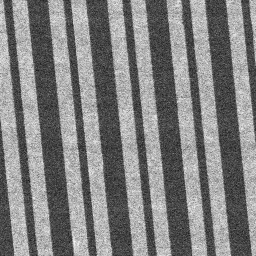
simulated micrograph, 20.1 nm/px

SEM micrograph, parallel lines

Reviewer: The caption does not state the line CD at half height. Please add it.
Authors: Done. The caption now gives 14.4 pixels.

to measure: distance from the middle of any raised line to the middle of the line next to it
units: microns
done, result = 0.593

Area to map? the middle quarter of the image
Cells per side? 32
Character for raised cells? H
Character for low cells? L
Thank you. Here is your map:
HLLLHHHLLLLLLHHHLLHHHHLLLLLHHHHL
HLLLHHHLLLLLLHHHLLLHHHLLLLLHHHHL
HLLLHHHLLLLLLHHHLLLHHHLLLLLLHHHL
HHLLHHHLLLLLLHHHLLLHHHLLLLLLHHHL
HHLLHHHLLLLLLHHHLLLHHHLLLLLLHHHL
HHLLHHHHLLLLLHHHHLLHHHLLLLLLHHHL
HHLLHHHHLLLLLHHHHLLHHHLLLLLLHHHL
HHLLHHHHLLLLLHHHHLLHHHHLLLLLHHHH
HHLLHHHHLLLLLHHHHLLHHHHLLLLLHHHH
HHLLHHHHLLLLLLHHHLLHHHHLLLLLHHHH
HHLLLHHHLLLLLLHHHLLHHHHLLLLLLHHH
HHLLLHHHLLLLLLHHHLLLHHHLLLLLLHHH
HHLLLHHHLLLLLLHHHLLLHHHLLLLLLHHH
HHHLLHHHLLLLLLHHHLLLHHHLLLLLLHHH
HHHLLHHHLLLLLLHHHLLLHHHLLLLLLHHH
HHHLLHHHHLLLLLHHHHLLHHHLLLLLLHHH
HHHLLHHHHLLLLLHHHHLLHHHLLLLLLHHH
HHHLLHHHHLLLLLHHHHLLHHHHLLLLLHHH
HHHLLLHHHLLLLLHHHHLLHHHHLLLLLHHH
HHHLLLHHHLLLLLLHHHLLHHHHLLLLLHHH
HHHLLLHHHLLLLLLHHHLLLHHHLLLLLHHH
HHHLLLHHHLLLLLLHHHLLLHHHLLLLLLHH
HHHHLLHHHLLLLLLHHHLLLHHHLLLLLLHH
HHHHLLHHHLLLLLLHHHLLLHHHLLLLLLHH
HHHHLLHHHHLLLLLHHHHLLHHHLLLLLLHH
HHHHLLHHHHLLLLLHHHHLLHHHLLLLLLHH
HHHHLLHHHHLLLLLHHHHLLHHHLLLLLLHH
LHHHLLHHHHLLLLLHHHHLLHHHHLLLLLHH
LHHHLLHHHHLLLLLHHHHLLHHHHLLLLLHH
LHHHLLLHHHLLLLLLHHHLLHHHHLLLLLHH
LHHHLLLHHHLLLLLLHHHLLLHHHLLLLLLH
LHHHLLLHHHLLLLLLHHHLLLHHHLLLLLLH